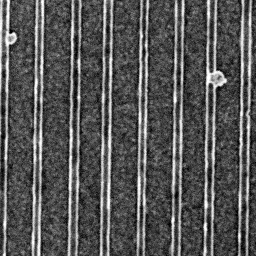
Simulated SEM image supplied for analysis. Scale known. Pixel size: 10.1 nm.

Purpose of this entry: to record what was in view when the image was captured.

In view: parallel lines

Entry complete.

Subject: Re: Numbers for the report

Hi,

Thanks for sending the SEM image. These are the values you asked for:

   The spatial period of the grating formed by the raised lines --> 346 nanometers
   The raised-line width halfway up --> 77.9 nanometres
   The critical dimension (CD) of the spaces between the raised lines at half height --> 26.7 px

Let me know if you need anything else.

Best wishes